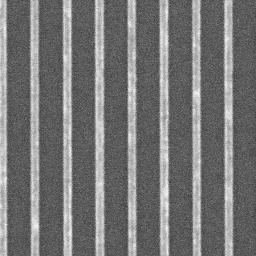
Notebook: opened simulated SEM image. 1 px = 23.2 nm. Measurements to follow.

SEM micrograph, parallel lines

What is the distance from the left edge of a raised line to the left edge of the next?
749 nanometres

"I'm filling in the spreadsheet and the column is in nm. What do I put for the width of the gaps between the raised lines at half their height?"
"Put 603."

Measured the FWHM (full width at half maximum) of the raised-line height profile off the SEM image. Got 0.157 microns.